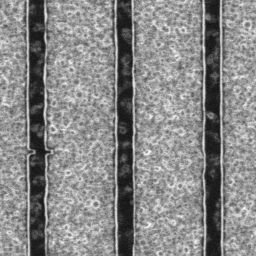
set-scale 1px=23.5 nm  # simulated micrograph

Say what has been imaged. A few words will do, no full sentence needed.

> one or a few lines or trenches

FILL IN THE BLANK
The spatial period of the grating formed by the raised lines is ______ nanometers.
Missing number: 2070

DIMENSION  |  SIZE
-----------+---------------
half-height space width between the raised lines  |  1.64 µm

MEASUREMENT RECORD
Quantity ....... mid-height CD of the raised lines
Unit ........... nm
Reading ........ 412